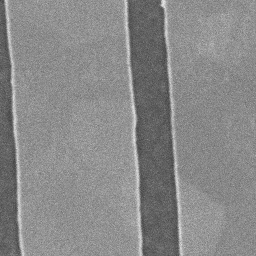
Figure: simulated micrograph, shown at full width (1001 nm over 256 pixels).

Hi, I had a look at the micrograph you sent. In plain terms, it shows one or a few lines or trenches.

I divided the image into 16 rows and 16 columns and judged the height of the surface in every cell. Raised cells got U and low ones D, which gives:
UUUUUUUUDDUUUUUU
UUUUUUUUDDUUUUUU
DUUUUUUUDDUUUUUU
DUUUUUUUDDDUUUUU
DUUUUUUUDDDUUUUU
DUUUUUUUDDDUUUUU
DUUUUUUUDDDUUUUU
DUUUUUUUDDDUUUUU
DUUUUUUUDDDUUUUU
DUUUUUUUDDDUUUUU
DUUUUUUUUDDUUUUU
DUUUUUUUUDDUUUUU
DUUUUUUUUDDUUUUU
DUUUUUUUUDDUUUUU
DUUUUUUUUDDUUUUU
DUUUUUUUUDDUUUUU